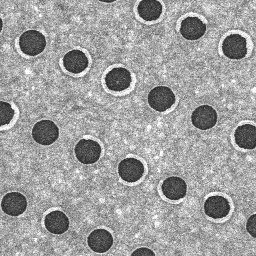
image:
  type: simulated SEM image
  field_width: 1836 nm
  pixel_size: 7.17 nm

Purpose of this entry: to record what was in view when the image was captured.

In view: a regular array of holes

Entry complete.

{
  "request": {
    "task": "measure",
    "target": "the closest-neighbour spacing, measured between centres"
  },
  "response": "333 nanometers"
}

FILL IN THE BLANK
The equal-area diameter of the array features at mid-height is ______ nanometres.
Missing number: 185